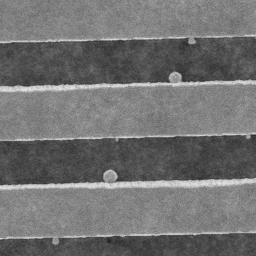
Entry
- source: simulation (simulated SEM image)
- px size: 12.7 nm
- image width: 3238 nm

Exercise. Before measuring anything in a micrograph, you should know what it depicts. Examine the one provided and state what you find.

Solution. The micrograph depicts lines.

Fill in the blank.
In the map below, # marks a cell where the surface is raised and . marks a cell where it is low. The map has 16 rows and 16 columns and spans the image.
################
################
######..........
................
................
.###############
################
################
###########.....
................
................
....############
################
################
################
................